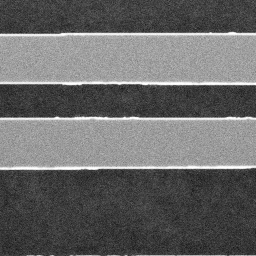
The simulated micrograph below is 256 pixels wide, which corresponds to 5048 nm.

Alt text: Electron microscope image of lines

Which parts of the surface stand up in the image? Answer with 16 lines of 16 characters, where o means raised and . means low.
................
................
oooooooooooooooo
oooooooooooooooo
oooooooooooooooo
................
................
oooooooooooooooo
oooooooooooooooo
oooooooooooooooo
oooooo..........
................
................
................
................
................